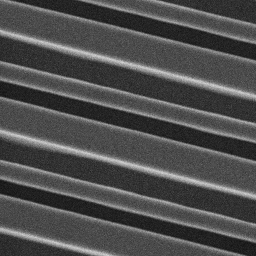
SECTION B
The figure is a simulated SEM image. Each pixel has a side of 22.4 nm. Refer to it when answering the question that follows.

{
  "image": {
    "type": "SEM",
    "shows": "lines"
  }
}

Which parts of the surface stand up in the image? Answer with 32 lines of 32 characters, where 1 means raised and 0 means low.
11100000000011111111100000000000
11111110000000001111111110000000
11111111111000000000111111111000
11111111111111100000000011111111
00111111111111111110000000001111
00000011111111111111111000000000
00000000011111111111111111100000
00000000000000111111111111111110
11100000000000000011111111111111
11111110000000000000011111111111
00111111111000000000000001111111
00000011111111100000000000000111
11000000000111111111000000000000
11111100000000011111111100000000
11111111100000000001111111110000
11111111111110000000000111111111
11111111111111111100000000011111
00001111111111111111100000000001
00000000111111111111111110000000
00000000000011111111111111111000
11000000000000001111111111111111
11111100000000000000111111111111
01111111110000000000000011111111
00000111111111000000000000001111
10000000011111111100000000000000
11111000000001111111110000000000
11111111100000000111111111000000
11111111111110000000011111111100
11111111111111111000000001111111
00011111111111111111100000000111
00000001111111111111111110000000
00000000000111111111111111111000